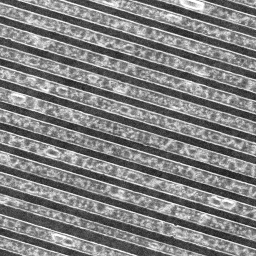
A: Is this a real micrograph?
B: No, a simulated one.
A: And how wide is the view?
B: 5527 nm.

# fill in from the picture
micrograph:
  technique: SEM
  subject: parallel lines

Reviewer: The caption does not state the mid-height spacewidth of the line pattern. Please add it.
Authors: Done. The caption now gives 178 nm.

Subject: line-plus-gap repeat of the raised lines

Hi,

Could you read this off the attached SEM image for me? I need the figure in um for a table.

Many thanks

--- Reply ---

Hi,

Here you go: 0.436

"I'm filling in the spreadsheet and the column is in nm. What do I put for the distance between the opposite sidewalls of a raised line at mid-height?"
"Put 258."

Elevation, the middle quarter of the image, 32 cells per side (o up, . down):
o.......ooooooooooo.......oooooo
oooo........oooooooooo.......ooo
oooooooo.......oooooooooo.......
.oooooooooo.......ooooooooooo...
....oooooooooo........oooooooooo
.......ooooooooooo.......ooooooo
oooo.......oooooooooo.......oooo
ooooooo.......oooooooooo........
oooooooooo.......ooooooooooo....
...ooooooooooo.......oooooooooo.
.......oooooooooo.......oooooooo
ooo.......oooooooooo.......ooooo
ooooo........oooooooooo........o
ooooooooo........oooooooooo.....
..ooooooooooo.......oooooooooo..
.....ooooooooooo.......ooooooooo
oo......ooooooooooo.......oooooo
ooooo.......ooooooooooo.......oo
oooooooo.......ooooooooooo......
.ooooooooooo......ooooooooooo...
....ooooooooooo......ooooooooooo
o......ooooooooooo.......ooooooo
oooo.......ooooooooooo......oooo
ooooooo.......ooooooooooo......o
ooooooooooo......ooooooooooo....
...ooooooooooo.......ooooooooooo
......ooooooooooo.......oooooooo
ooo.......ooooooooooo......ooooo
ooooooo......ooooooooooo......oo
oooooooooo......ooooooooooo.....
..ooooooooooo.......ooooooooooo.
.....ooooooooooo.......ooooooooo